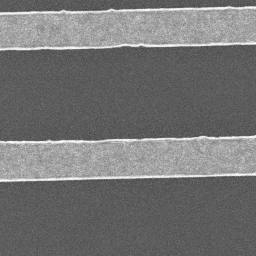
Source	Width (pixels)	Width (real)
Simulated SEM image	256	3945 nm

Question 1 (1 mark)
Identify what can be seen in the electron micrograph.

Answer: one or a few lines or trenches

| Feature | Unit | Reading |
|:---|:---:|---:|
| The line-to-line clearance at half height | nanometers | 1440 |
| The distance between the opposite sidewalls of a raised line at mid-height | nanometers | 570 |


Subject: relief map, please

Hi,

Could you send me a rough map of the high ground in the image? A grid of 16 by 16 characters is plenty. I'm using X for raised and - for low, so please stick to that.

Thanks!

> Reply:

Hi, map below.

--------------XX
XXXXXXXXXXXXXXXX
XXXXXXXXXXXXXXXX
----------------
----------------
----------------
----------------
----------------
----------------
XXXXXXXXXXXXXXXX
XXXXXXXXXXXXXXXX
----------------
----------------
----------------
----------------
----------------